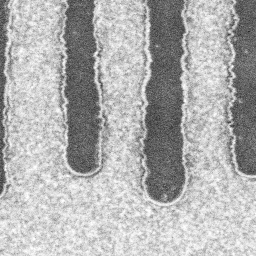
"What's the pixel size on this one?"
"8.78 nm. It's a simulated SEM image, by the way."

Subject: one or a few lines or trenches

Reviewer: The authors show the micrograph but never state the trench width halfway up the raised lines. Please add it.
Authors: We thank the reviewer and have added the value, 451 nanometers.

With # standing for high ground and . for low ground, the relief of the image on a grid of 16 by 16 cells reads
#...##...###...#
#...##...###...#
#...##...###..##
....##...###...#
....##...###..##
....##...###..##
....##...###..##
....##...##...##
....##...###...#
....##...###...#
....##...###...#
.........###....
..........#.....
................
................
................